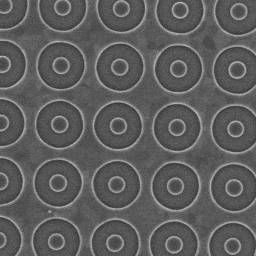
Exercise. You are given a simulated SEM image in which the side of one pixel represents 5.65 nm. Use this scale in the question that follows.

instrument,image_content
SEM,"an array of small figures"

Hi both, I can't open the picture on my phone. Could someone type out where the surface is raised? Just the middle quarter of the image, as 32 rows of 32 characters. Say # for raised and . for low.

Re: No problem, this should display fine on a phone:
#....###....####....###....###..
#....###....####....###....####.
.....###.....##.....###....###..
....#####..........####.........
...######..........#####........
..########........######........
############....##########.....#
################################
################################
.############.##################
...#######.......#########.....#
....#####.........######........
....####...........####.........
.....###...........####.........
#....##.....###....####....###..
#....##.....###.....##....####..
.....###....###....###....####..
....####...........####....##...
....####...........####.........
...######.........######........
..########.......#######........
##########################....##
###############################.
################################
.###########...#################
...#######.......########......#
....#####.........######........
....####..........#####.........
....###.....##.....###..........
.....##....####....###....####..
....###....####....###....####..
....###.....###....###....####..